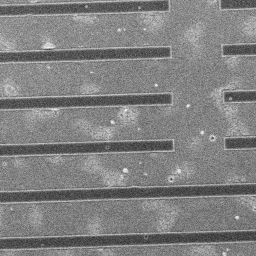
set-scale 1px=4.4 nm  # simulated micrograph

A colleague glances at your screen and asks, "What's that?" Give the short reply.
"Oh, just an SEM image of parallel lines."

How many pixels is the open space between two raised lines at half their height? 34.8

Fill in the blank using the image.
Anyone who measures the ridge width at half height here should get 53.4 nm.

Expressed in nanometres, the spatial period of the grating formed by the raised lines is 205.